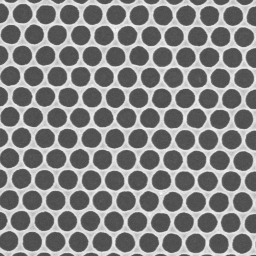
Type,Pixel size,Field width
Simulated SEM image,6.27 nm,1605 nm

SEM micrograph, a regular array of holes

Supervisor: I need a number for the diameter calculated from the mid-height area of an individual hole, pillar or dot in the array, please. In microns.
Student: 0.124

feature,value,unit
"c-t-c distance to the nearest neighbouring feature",23.1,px